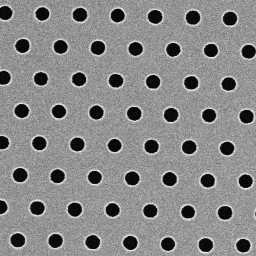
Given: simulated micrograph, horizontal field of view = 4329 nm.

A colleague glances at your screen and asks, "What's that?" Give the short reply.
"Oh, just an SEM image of a regular array of holes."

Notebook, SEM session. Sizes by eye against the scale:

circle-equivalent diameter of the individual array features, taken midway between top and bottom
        0.241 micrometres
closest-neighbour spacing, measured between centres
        627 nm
